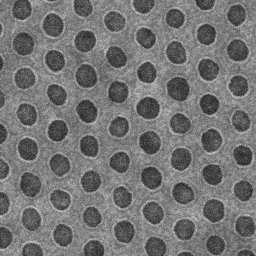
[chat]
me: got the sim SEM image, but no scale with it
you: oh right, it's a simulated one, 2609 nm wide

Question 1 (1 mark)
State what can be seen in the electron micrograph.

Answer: a regular array of holes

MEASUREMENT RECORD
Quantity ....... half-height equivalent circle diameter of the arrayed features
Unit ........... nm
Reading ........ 224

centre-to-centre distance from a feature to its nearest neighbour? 351 nm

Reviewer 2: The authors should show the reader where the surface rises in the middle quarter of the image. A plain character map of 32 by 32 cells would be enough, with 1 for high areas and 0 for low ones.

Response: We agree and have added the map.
11110001111100011110000111111111
11100000111111111100000111111111
11100000111111111100000111111111
11100000111111111110000111100011
11100000111100011110001111000001
11110000111000001111111111000001
11111111111000001111111111000000
01111111111000001111111111000001
01111111111000001111000111100001
01110001111100011110000011111111
11100000111111111100000011111111
11100000011111111100000011111111
11100000111111111110000011110011
11110000111110011111000111100001
11111000111100001111111111000000
01111111111000001111111111100000
01111111111000001111111111100001
01111111111100001110000011110011
11110000111110011110000011111111
11110000011111111110000011111111
11110000011111111110000011111111
11110000011111111111000011110001
11111000111100001111100111100000
01111111111100001111111111100000
01111111111000000111111111100000
00111111111000001111111111100001
00111111111100001111000011110011
01111000011111111110000011111111
11110000011111111110000001111111
11110000011111111110000001111111
11110000011111011111000011100001
11111000111100001111111111100000